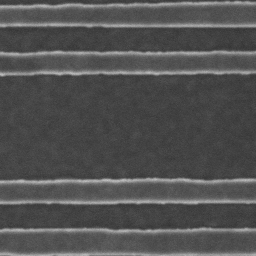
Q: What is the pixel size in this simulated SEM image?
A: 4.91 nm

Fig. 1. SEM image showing lines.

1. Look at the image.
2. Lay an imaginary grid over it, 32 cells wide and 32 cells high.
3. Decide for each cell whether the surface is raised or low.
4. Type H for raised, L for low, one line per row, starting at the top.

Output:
LLLLLLLLLLLLLLLLLHHLHHHHHHHHHHHH
HHHHHHHHHHHHHHHHHHHHHHHHHHHHHHHH
HHHHHHHHHHHHHHHHHHHHHHHHHHHHHHHH
LLLLLLLLLLLLLLLLLLLLLLLLLLLLLLLL
LLLLLLLLLLLLLLLLLLLLLLLLLLLLLLLL
LLLLLLLLLLLLLLLLLLLLLLLLLLLLLLLL
LLLLLLHHLLLLLLLLHLLLLLLLLLHHHHLL
HHHHHHHHHHHHHHHHHHHHHHHHHHHHHHHH
HHHHHHHHHHHHHHHHHHHHHHHHHHHHHHHH
LLLLLLLLLLLLLLLLLLLLLLLLLLLLLLLL
LLLLLLLLLLLLLLLLLLLLLLLLLLLLLLLL
LLLLLLLLLLLLLLLLLLLLLLLLLLLLLLLL
LLLLLLLLLLLLLLLLLLLLLLLLLLLLLLLL
LLLLLLLLLLLLLLLLLLLLLLLLLLLLLLLL
LLLLLLLLLLLLLLLLLLLLLLLLLLLLLLLL
LLLLLLLLLLLLLLLLLLLLLLLLLLLLLLLL
LLLLLLLLLLLLLLLLLLLLLLLLLLLLLLLL
LLLLLLLLLLLLLLLLLLLLLLLLLLLLLLLL
LLLLLLLLLLLLLLLLLLLLLLLLLLLLLLLL
LLLLLLLLLLLLLLLLLLLLLLLLLLLLLLLL
LLLLLLLLLLLLLLLLLLLLLLLLLLLLLLLL
LLLLLLLLLLLLLLLLLLLLLLLLLLLLLLLL
LLLLLLLLLLLLHHLHHHHHHHHHLLLLLHHH
HHHHHHHHHHHHHHHHHHHHHHHHHHHHHHHH
HHHHHHHHHHHHHHHHHHHHHHHHHHHHHHHH
LLLLLLLLLLLLLLLLLLLLLLLLLLLLLLLL
LLLLLLLLLLLLLLLLLLLLLLLLLLLLLLLL
LLLLLLLLLLLLLLLLLLLLLLLLLLLLLLLL
LLLLLLLLLLLLLLLLLLLLLLLLLLLLLLLL
HHHHHHHHHHHHHHHHHHHHHHHHHHHHHHHH
HHHHHHHHHHHHHHHHHHHHHHHHHHHHHHHH
HHHHHHHHHHHHHHHHHHHHHHHHHHHHHHHH